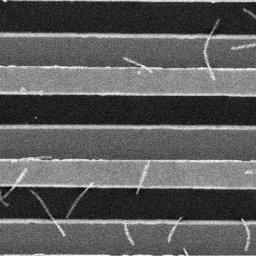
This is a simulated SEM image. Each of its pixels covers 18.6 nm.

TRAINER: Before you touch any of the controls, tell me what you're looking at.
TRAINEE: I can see lines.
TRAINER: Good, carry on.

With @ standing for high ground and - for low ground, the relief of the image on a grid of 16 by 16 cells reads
----------------
----------------
@@@@@@@@@@@@@@@@
@@@@@@@@@@@@@@@@
@@@@@@@@@@@@@@@@
@@@@@@@@@@@@@@@@
----------------
----------------
@@@@@@@@@@@@@@@@
@@@@@@@@@@@@@@@@
@@@@@@@@@@@@@@@@
@@@@@@@@@@@@@@@@
----------------
----------------
@@@@@@@@@@@@@@@@
@@@@@@@@@@@@@@@@